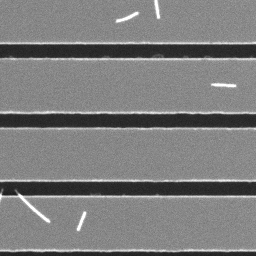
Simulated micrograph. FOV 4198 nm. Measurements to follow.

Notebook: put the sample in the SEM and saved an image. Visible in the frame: lines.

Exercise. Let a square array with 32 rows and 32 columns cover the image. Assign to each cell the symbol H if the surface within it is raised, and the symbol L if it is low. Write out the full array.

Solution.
HHHHHHHHHHHHHHHHHHHHHHHHHHHHHHHH
HHHHHHHHHHHHHHHHHHHHHHHHHHHHHHHH
HHHHHHHHHHHHHHHHHHHHHHHHHHHHHHHH
HHHHHHHHHHHHHHHHHHHHHHHHHHHHHHHH
HHHHHHHHHHHHHHHHHHHHHHHHHHHHHHHH
LLLLLLLLLLLLLLLLLLLLLLLLLLLLLLLL
LLLLLLLLLLLLLLLLLLLLLLLLLLLLLLLL
HHHHHHHHHHHHHHHHHHHHHHHHHHHHHHHH
HHHHHHHHHHHHHHHHHHHHHHHHHHHHHHHH
HHHHHHHHHHHHHHHHHHHHHHHHHHHHHHHH
HHHHHHHHHHHHHHHHHHHHHHHHHHHHHHHH
HHHHHHHHHHHHHHHHHHHHHHHHHHHHHHHH
HHHHHHHHHHHHHHHHHHHHHHHHHHHHHHHH
HHHHHHHHHHHHHHHHHHHHHHHHHHHHHHHH
LLLLLLLLLLLLLLLLLLLLLLLLLLLLLLLL
LLLLLLLLLLLLLLLLLLLLLLLLLLLLLLLL
HHHHHHHHHHHHHHHHHHHHHHHHHHHHHHHH
HHHHHHHHHHHHHHHHHHHHHHHHHHHHHHHH
HHHHHHHHHHHHHHHHHHHHHHHHHHHHHHHH
HHHHHHHHHHHHHHHHHHHHHHHHHHHHHHHH
HHHHHHHHHHHHHHHHHHHHHHHHHHHHHHHH
HHHHHHHHHHHHHHHHHHHHHHHHHHHHHHHH
HHHHHHHHHHHHHHHHHHHHHHHHHHHHHHHH
LLLLLLLLLLLLLLLLLLLLLLLLLLLLLLLL
HLHLLLLLLLLLLLLLLLLLLLLLLLLLLLLL
HHHHHHHHHHHHHHHHHHHHHHHHHHHHHHHH
HHHHHHHHHHHHHHHHHHHHHHHHHHHHHHHH
HHHHHHHHHHHHHHHHHHHHHHHHHHHHHHHH
HHHHHHHHHHHHHHHHHHHHHHHHHHHHHHHH
HHHHHHHHHHHHHHHHHHHHHHHHHHHHHHHH
HHHHHHHHHHHHHHHHHHHHHHHHHHHHHHHH
LLLLLLLLLLLLLLLLLLLLLLLLLLLLLLLL